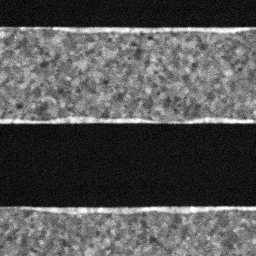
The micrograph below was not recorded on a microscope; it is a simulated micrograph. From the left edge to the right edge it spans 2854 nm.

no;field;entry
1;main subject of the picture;wiring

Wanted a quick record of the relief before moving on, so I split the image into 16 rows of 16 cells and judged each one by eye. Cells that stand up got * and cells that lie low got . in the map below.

................
................
****************
****************
****************
****************
****************
*****.**********
................
................
................
................
................
****************
****************
****************